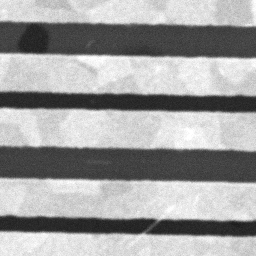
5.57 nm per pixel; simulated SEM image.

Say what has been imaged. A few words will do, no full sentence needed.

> lines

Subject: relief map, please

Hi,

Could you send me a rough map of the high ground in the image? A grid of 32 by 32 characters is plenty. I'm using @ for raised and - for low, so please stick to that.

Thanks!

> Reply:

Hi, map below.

@@@@@@@@@@@@@@@@@@@@@@@@@@@@@@@@
@@@@@@@@@@@@@@@@@@@@@@@@@@@@@@@@
@@@@@@@@@@@@@@@@@@@@@@@@@@@@@@@@
--------------------------------
--------------------------------
--------------------------------
--------------------------------
@@@@@@@@@@@@@@@@@@@@@@@@@@@@@@@@
@@@@@@@@@@@@@@@@@@@@@@@@@@@@@@@@
@@@@@@@@@@@@@@@@@@@@@@@@@@@@@@@@
@@@@@@@@@@@@@@@@@@@@@@@@@@@@@@@@
-------@@@@@@@@@@@@@@@@@@@@@@@@@
--------------------------------
@-------------------------------
@@@@@@@@@@@@@@@@@@@@@@@@@@@@@@@@
@@@@@@@@@@@@@@@@@@@@@@@@@@@@@@@@
@@@@@@@@@@@@@@@@@@@@@@@@@@@@@@@@
@@@@@@@@@@@@@@@@@@@@@@@@@@@@@@@@
----------------@@@@@@@@@@@@@@@@
--------------------------------
--------------------------------
--------------------------------
@@@@@---------------------------
@@@@@@@@@@@@@@@@@@@@@@@@@@@@@@@@
@@@@@@@@@@@@@@@@@@@@@@@@@@@@@@@@
@@@@@@@@@@@@@@@@@@@@@@@@@@@@@@@@
@@@@@@@@@@@@@@@@@@@@@@@@@@@@@@@@
---------------------------@@@@@
--------------------------------
@@@@@@@@@@@@@@@@@@@@@@@@--------
@@@@@@@@@@@@@@@@@@@@@@@@@@@@@@@@
@@@@@@@@@@@@@@@@@@@@@@@@@@@@@@@@